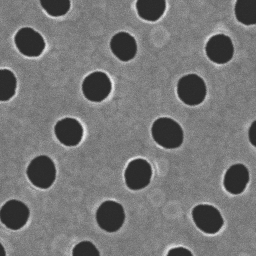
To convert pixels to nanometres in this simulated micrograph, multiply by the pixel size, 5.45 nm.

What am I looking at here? a regular array of holes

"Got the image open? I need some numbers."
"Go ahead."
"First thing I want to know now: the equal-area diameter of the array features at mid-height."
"0.165 um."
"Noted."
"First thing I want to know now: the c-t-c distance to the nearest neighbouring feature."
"268 nm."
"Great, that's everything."